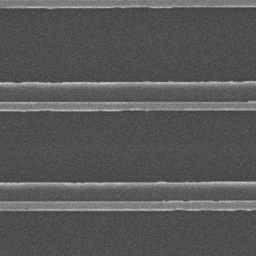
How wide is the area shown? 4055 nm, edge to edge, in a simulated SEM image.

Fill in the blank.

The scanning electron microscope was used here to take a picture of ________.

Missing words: lines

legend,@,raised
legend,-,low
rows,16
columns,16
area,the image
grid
----------------
----------------
----------------
----------------
----------------
@@@@@@@@@@@@@@@@
@@@@@@@@@@@@@@@@
----------------
----------------
----------------
----------------
-@@@@@@@@@@@@@@@
@@@@@@@@@@@@@@@@
----------------
----------------
----------------